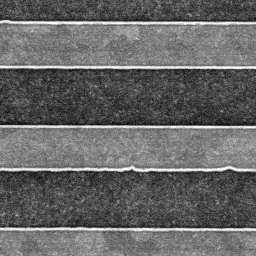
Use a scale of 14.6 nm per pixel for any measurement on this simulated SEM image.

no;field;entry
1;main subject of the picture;one or a few lines or trenches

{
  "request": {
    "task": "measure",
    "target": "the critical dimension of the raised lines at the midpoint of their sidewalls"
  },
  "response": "642 nanometres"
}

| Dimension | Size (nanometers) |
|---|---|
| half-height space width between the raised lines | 851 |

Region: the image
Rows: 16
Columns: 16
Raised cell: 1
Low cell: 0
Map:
0000000000000000
1111111111111111
1111111111111111
1111111111111111
0000000000000000
0000000000000000
0000000000000000
0000000000000000
1111111111111111
1111111111111111
1111111111111111
0000000000000000
0000000000000000
0000000000000000
1111111111111111
1111111111111111